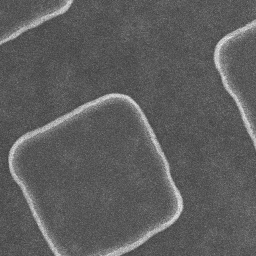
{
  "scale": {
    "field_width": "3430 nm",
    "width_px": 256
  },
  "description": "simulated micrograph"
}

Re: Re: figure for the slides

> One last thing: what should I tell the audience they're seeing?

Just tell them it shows raised bodies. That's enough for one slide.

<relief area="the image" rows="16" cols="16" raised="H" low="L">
HHHHLLLLLLLLLLLL
HHLLLLLLLLLLLLLL
LLLLLLLLLLLLLLHH
LLLLLLLLLLLLLLHH
LLLLLLLLLLLLLLHH
LLLLLLLLLLLLLLHH
LLLLLLHHLLLLLLLH
LLLLHHHHHLLLLLLH
LLHHHHHHHHLLLLLL
LHHHHHHHHHLLLLLL
LHHHHHHHHHLLLLLL
LHHHHHHHHHHLLLLL
LLHHHHHHHHHLLLLL
LLHHHHHHHHHLLLLL
LLLHHHHHHHLLLLLL
LLLHHHHHLLLLLLLL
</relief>